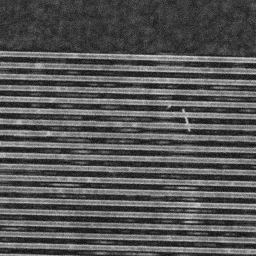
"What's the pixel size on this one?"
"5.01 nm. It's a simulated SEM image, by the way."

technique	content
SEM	parallel lines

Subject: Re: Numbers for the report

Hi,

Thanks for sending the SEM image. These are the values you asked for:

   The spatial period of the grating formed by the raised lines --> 56.3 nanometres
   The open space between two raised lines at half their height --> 35.1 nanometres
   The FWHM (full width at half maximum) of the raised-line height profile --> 21.9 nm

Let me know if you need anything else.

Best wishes